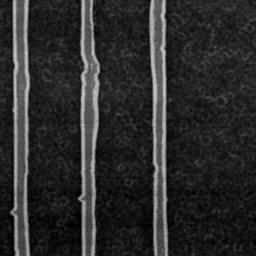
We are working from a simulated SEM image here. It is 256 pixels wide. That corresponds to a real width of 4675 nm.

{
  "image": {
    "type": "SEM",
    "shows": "one or a few lines or trenches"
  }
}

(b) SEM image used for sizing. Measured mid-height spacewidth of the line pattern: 1060 nanometers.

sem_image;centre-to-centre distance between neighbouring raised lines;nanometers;1260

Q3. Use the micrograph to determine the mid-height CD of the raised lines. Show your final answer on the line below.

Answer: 203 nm